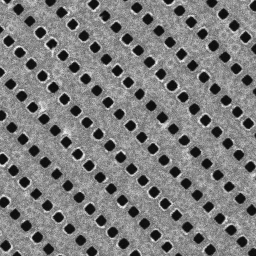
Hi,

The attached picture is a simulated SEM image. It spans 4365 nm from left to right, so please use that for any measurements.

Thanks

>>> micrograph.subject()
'a regular array of holes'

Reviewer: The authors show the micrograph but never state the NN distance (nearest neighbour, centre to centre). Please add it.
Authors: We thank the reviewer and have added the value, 16 px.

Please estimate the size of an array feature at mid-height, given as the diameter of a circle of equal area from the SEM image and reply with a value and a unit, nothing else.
182 nm